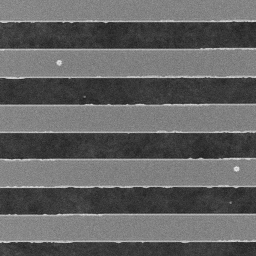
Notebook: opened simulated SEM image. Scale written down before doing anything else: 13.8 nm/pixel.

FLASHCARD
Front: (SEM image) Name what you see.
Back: lines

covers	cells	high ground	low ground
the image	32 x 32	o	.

oooooooooooooooooooooooooooooooo
oooooooooooooooooooooooooooooooo
oooooooooooooooooooooooooooooooo
................................
................................
................................
oooooooooooooooooooooooooooooooo
oooooooooooooooooooooooooooooooo
oooooooooooooooooooooooooooooooo
oooooooooooooooooooooooooooooooo
................................
................................
................................
oooooooooooooooooooooooooooooooo
oooooooooooooooooooooooooooooooo
oooooooooooooooooooooooooooooooo
oooooooooooooooooooooooooooooooo
................................
................................
................................
oooooooooooooooooooooooooooooooo
oooooooooooooooooooooooooooooooo
oooooooooooooooooooooooooooooooo
................................
................................
................................
................................
oooooooooooooooooooooooooooooooo
oooooooooooooooooooooooooooooooo
oooooooooooooooooooooooooooooooo
................................
................................